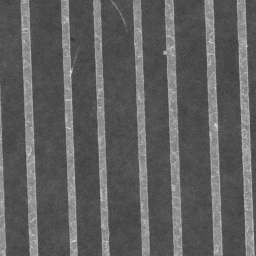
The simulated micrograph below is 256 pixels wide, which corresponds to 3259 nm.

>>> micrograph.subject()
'parallel lines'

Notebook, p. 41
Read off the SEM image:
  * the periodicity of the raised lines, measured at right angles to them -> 36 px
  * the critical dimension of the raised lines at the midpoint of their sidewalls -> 0.097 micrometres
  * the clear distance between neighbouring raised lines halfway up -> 0.325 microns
